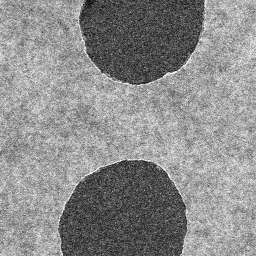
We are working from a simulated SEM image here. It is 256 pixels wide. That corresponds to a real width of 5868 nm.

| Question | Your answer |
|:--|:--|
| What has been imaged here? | holes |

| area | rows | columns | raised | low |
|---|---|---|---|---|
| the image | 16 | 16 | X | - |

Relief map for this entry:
XXXXX--------XXX
XXXXX--------XXX
XXXXX-------XXXX
XXXXXX------XXXX
XXXXXX-----XXXXX
XXXXXXXXXXXXXXXX
XXXXXXXXXXXXXXXX
XXXXXXXXXXXXXXXX
XXXXXXXXXXXXXXXX
XXXXXXXXXXXXXXXX
XXXXXX----XXXXXX
XXXXX------XXXXX
XXXX-------XXXXX
XXXX--------XXXX
XXXX--------XXXX
XXXX-------XXXXX